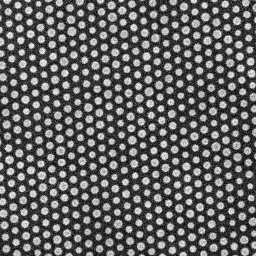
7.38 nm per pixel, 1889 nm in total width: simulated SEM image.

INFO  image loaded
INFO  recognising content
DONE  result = a regular array of raised bodies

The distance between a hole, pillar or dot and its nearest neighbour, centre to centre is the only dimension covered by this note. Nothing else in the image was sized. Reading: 86.1 nm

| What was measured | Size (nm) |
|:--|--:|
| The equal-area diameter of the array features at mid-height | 47.1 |